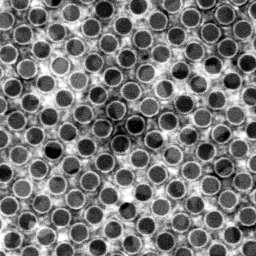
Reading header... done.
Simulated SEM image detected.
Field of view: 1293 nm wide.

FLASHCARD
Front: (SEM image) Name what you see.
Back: a regular array of raised bodies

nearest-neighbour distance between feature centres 118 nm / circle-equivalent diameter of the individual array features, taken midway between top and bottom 95.9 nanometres